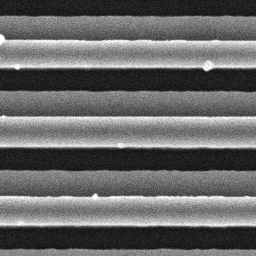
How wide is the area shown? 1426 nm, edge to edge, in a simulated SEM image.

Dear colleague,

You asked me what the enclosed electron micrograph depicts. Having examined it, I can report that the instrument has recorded lines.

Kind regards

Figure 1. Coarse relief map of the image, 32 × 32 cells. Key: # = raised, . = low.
................................
................................
################################
################################
################################
################################
################################
################################
.##..............###.....##...#.
................................
................................
#.##.######..###.###.#.###.#.#..
################################
################################
################################
################################
################################
################################
................................
................................
................................
################################
################################
################################
################################
################################
################################
################################
................................
................................
................................
################################